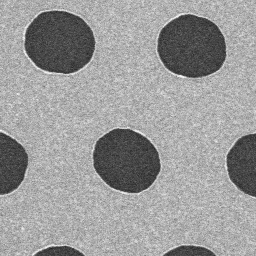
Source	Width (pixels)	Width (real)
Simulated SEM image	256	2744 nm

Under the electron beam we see holes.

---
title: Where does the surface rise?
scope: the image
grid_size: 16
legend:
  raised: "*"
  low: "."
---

****************
**...*****...***
**....****....**
**....****....**
***..******..***
****************
****************
****************
.*****...******.
..****....****..
..****....****..
.******..******.
****************
****************
****************
***..******..***